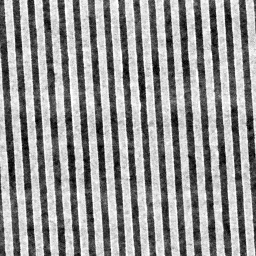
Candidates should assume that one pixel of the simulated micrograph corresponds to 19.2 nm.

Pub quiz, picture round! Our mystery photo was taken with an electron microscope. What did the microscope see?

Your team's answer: parallel lines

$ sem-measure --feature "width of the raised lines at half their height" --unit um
0.134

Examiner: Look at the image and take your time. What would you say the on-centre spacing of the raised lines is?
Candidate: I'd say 0.288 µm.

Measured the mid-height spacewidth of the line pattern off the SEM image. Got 8.11 pixels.